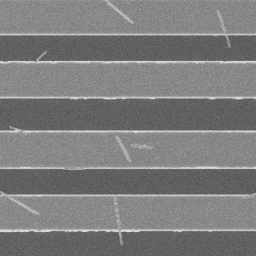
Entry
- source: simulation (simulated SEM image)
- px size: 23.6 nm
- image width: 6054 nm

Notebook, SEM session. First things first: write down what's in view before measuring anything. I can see lines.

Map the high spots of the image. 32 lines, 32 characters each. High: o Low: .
oooooooooooooooooooooooooooooooo
oooooooooooooooooooooooooooooooo
oooooooooooooooooooooooooooooooo
oooooooooooooooooooooooooooooooo
................................
................................
................................
................................
oooooooooooooooooooooooooooooooo
oooooooooooooooooooooooooooooooo
oooooooooooooooooooooooooooooooo
oooooooooooooooooooooooooooooooo
................................
................................
................................
................................
oooooooooooooooooooooooooooooooo
oooooooooooooooooooooooooooooooo
oooooooooooooooooooooooooooooooo
oooooooooooooooooooooooooooooooo
oooooooooooooooooooooooooooooooo
................................
................................
................................
oooooooooooooooooooooooooooooooo
oooooooooooooooooooooooooooooooo
oooooooooooooooooooooooooooooooo
oooooooooooooooooooooooooooooooo
oooooooooooooooooooooooooooooooo
................................
................................
................................